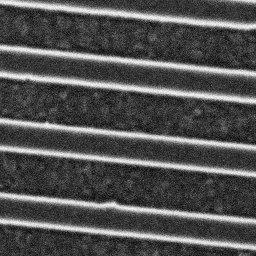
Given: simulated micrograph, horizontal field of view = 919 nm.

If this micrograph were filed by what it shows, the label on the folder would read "one or a few lines or trenches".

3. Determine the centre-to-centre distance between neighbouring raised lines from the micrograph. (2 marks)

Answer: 0.263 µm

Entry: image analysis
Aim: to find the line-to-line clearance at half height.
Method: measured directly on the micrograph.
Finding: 163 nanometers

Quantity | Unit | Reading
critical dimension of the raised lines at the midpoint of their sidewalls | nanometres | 99.7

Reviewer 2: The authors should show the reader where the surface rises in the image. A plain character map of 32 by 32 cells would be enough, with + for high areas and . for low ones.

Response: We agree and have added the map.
..++++++++++++++++++++++++++++++
...........+++++++++++++++++++++
.....................+++++++++++
................................
................................
................................
++++++..........................
+++++++++++++++.................
+++++++++++++++++++++++++.......
.+++++++++++++++++++++++++++++++
...........+++++++++++++++++++++
....................++++++++++++
..............................++
................................
................................
++++............................
+++++++++++++...................
+++++++++++++++++++++++.........
++++++++++++++++++++++++++++++++
.........+++++++++++++++++++++++
...................+++++++++++++
............................++++
................................
................................
++..............................
+++++++++++.....................
+++++++++++++++++++++...........
+++++++++++++++++++++++++++++++.
.......+++++++++++++++++++++++++
.................+++++++++++++++
...........................+++++
................................